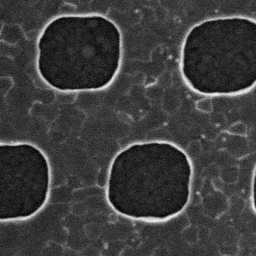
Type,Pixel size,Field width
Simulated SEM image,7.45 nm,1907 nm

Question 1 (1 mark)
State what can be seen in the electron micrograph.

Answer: holes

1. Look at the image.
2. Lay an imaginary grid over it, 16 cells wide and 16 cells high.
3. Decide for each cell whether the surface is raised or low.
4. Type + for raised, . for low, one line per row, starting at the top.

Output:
++++++++++++++++
+++....++++++...
+++....+++++....
++.....++++.....
+++....++++.....
++++..++++++...+
++++++++++++++++
++++++++++++++++
++++++++++++++++
..++++++...+++++
...++++.....++++
...++++.....++++
...++++.....++++
..++++++...+++++
++++++++++++++++
++++++++++++++++